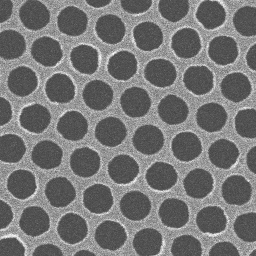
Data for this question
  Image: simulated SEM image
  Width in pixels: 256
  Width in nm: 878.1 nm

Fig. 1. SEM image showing a regular array of holes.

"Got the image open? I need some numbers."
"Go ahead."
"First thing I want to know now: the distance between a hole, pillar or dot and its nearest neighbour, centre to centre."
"131 nm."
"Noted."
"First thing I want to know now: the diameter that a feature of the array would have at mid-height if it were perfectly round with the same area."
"103 nanometres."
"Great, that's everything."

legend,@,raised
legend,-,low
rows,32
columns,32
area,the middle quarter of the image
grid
@@-------@@-------@@-------@@@@@
@@@-----@@@-------@@--------@@@-
@@@@@--@@@@-------@@--------@@--
-@@@@@@@@@@@@----@@@--------@@--
--@@@@----@@@@@@@@@@@-------@@--
---@@------@@@@@@@@@@@@----@@@--
---@@-------@@@@----@@@@@@@@@@@-
---@@-------@@@------@@@@@@@@@@@
--@@@-------@@-------@@@@----@@@
-@@@@-------@@--------@@------@@
@@@@@@-----@@@--------@@-------@
@@@@@@@@--@@@@@------@@--------@
----@@@@@@@@@@@------@@@-------@
-----@@@@@---@@@@@@@@@@@-------@
------@@@------@@@@@@@@@@-----@@
------@@-------@@@@----@@@@@@@@@
------@@--------@@------@@@@@@@@
------@@--------@@-------@@@----
----@@@@-------@@--------@@-----
@@@@@@@@@------@@--------@@-----
@@@@@@@@@@@--@@@@--------@@-----
@@@----@@@@@@@@@@@------@@@-----
@@-------@@@@@@@@@@@--@@@@@-----
@@-------@@@-----@@@@@@@@@@@----
@--------@@-------@@@@@--@@@@@-@
@@-------@@--------@@@-----@@@@@
@@-------@@--------@@-------@@@@
@@@-----@@@--------@--------@@@-
@@@@@@@@@@@@------@@--------@@--
--@@@@@@@@@@@----@@@@-------@@--
--@@@@@----@@@@@@@@@@------@@@--
---@@-------@@@@@@@@@@@---@@@@--